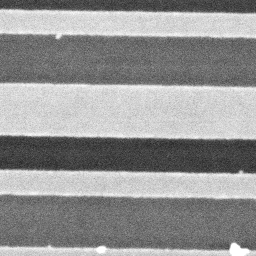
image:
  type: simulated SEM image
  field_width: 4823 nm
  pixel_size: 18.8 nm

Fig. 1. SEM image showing lines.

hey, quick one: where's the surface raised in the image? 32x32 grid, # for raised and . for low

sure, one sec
................................
#########.......................
################################
################################
..........................######
................................
................................
................................
................................
................................
................................
################################
################################
################################
################################
################################
################################
................................
................................
................................
................................
#############...................
################################
################################
.....................###########
................................
................................
................................
................................
................................
................................
################################